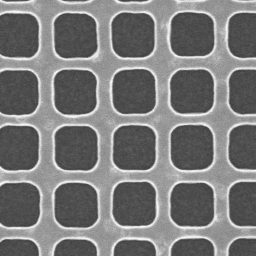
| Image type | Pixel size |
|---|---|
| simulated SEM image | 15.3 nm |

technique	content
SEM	a regular array of holes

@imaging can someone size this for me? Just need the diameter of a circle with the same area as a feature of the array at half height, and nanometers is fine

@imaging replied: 736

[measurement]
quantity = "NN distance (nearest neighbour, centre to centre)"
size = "860 nanometers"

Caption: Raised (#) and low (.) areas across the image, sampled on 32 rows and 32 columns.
################################
###############...#####.########
.....##.....##.....##......##...
.....##.....##.....##......#....
.....##.....##.....##......#....
.....##.....##.....##......##...
.....##.....##.....###....###...
################################
################################
....###.....##.....###.....##...
.....##.....##.....##......##...
.....##.....##.....##......##...
.....##.....##.....##......##...
.....##.....##.....##.....###...
################################
###############################.
.....##.....##.....##.....###...
.....##.....##......#......##...
.....##.....##......#......#....
.....##.....##......#......##...
.....##.....##.....###....###...
################################
################################
.....##.....##.....###....###...
.....##.....##......#......##...
.....##.....##......#......#....
.....##.....##......#......##...
.....##.....##.....###.....##...
#########..#####################
################################
....###.....###....###.....##...
.....##.....##......#......##...